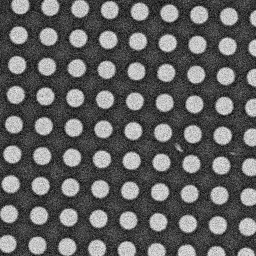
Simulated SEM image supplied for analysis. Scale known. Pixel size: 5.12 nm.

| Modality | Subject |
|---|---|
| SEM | an array of small figures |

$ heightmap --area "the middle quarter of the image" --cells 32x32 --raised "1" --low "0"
01111000011110000111000001100000
01111000011110001111000011110001
00111000011100001111000011110001
00000000001000000110000011100001
00000000000000000000000000000000
00000000000000000000000000000000
00100000000000000000000000000000
01111000011100000110000000000000
01111000111100001111000011100001
01111000111100001111000111100001
00100000011100001110000111100001
00000000000000000000000011000001
00000000000000000000000000000000
00000000000000000000000000000000
01110000011000000000000000000000
11110000111100001110000111000000
11110000111100011110000111100011
01110000111100011110000111100011
00000000000000001100000111000011
00000000000000000000000000000001
00000000000000000000000000000000
01100000000000000000000000000000
11110000111000001100000000000000
11110000111100011110000111000011
11110000111000011110001111000011
00000000111000011110001111000011
00000000000000000000000010000011
00000000000000000000000000000000
00000000000000000000000000000000
11100000110000000000000000000000
11110001111000011100000110000001
11110001111000011110001111000011